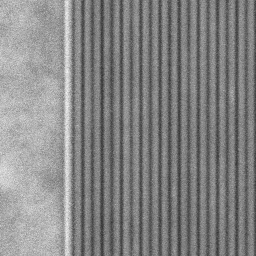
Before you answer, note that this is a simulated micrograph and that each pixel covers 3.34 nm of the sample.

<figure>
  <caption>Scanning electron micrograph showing parallel lines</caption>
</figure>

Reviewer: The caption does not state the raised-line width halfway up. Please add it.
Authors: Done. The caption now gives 22.9 nanometres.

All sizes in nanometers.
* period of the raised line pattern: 31.9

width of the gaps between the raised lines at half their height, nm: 10